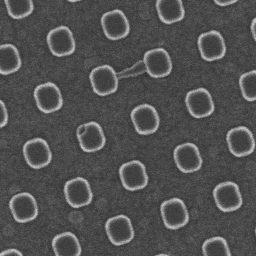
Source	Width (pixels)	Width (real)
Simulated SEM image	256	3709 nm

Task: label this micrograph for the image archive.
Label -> a regular array of raised bodies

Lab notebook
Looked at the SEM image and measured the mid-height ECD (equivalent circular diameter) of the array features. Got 393 nanometers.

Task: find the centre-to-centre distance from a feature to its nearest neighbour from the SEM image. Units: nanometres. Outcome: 810